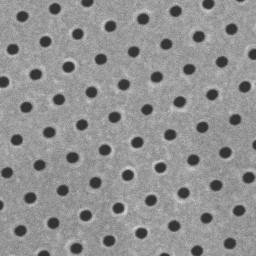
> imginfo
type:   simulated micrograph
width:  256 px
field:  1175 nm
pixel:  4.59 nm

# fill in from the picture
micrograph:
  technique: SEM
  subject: a regular array of holes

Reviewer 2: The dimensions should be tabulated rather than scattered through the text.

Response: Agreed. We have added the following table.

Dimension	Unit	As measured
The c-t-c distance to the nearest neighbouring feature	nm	153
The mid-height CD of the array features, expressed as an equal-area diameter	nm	53.3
